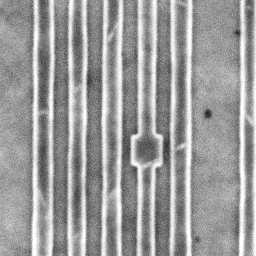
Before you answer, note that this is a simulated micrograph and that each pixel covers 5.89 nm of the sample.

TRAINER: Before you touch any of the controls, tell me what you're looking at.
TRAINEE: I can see wiring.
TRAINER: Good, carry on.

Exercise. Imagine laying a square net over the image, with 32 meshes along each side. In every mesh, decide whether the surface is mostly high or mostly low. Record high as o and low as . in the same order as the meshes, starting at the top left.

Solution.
....ooo..oo..oo..oo...oo......oo
....ooo..oo..oo..oo...oo......oo
....ooo..oo..oo..oo...oo......oo
....ooo..oo..oo..oo...oo......oo
....ooo..oo..oo..oo...oo......oo
....ooo..oo..oo..oo...oo......oo
....ooo..oo..oo..oo...oo......oo
....ooo..oo..oo..oo...oo......oo
....ooo..oo..oo..oo...oo......oo
....ooo..oo..oo..oo...oo......oo
....ooo..oo..oo..oo...oo......oo
....oo...oo..oo..oo...oo......oo
....oo...oo..oo..oo...oo......oo
....oo...oo..oo..oo...oo......oo
....oo...oo..oo..oo...oo......oo
....oo...oo..oo..oo...oo......oo
....oo...oo..oo..ooo..oo......oo
....oo...oo..oo..ooo..oo......oo
....oo...oo..oo..ooo..oo......oo
....oo...oo..oo..ooo..oo......oo
....oo...oo..oo..ooo..oo......oo
....oo...oo..oo..oo...oo......oo
....oo...oo..oo..oo...oo......oo
....oo...oo..oo..oo...oo......oo
....oo...oo..oo..oo...oo......oo
....oo...oo..oo..oo...oo......oo
....oo...oo..oo..oo...oo......oo
....oo...oo..oo..oo...oo......oo
....oo...oo..oo..oo...oo......oo
....oo...oo..oo..oo..ooo......oo
....oo...oo..oo..oo..ooo......oo
....oo...oo..oo..oo..ooo......oo